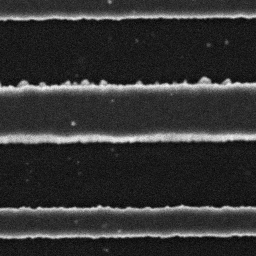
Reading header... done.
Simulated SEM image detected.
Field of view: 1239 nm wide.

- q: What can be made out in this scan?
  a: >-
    lines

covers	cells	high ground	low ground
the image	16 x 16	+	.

++++++++++++++++
................
................
................
................
++++++++++++++++
++++++++++++++++
++++++++++++++++
++++++++++++++++
................
................
................
................
++++++++++++++++
++++++++++++++++
................